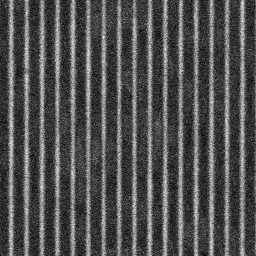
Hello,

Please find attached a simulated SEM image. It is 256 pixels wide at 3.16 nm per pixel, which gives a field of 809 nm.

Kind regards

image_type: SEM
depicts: parallel lines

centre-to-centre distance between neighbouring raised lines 0.0488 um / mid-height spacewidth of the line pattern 40.7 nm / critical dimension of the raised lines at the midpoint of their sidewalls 8.3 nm